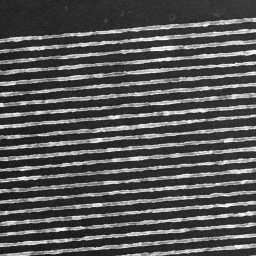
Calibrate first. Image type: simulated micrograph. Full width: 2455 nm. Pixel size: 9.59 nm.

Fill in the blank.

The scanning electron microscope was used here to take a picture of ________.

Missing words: parallel lines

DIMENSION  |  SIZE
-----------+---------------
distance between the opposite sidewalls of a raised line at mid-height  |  27.5 nm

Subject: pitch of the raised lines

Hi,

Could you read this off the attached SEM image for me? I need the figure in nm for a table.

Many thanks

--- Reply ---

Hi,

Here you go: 103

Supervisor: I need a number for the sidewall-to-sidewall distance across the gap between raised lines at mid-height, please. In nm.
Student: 76.5